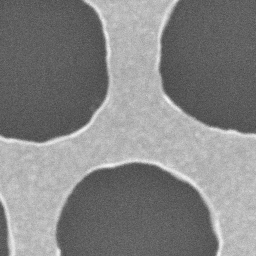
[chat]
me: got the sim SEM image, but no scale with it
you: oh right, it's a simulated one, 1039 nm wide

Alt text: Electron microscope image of holes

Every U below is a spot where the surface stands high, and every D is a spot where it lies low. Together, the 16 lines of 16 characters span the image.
DDDDDDUUUUUDDDDD
DDDDDDUUUUDDDDDD
DDDDDDDUUUDDDDDD
DDDDDDDUUUDDDDDD
DDDDDDDUUUDDDDDD
DDDDDDDUUUDDDDDD
DDDDDDUUUUUDDDDD
DDDDDDUUUUUUDDDD
DDDDUUUUUUUUUUUU
UUUUUUUUUUUUUUUU
UUUUUUDDDDUUUUUU
UUUUUDDDDDDDUUUU
UUUUDDDDDDDDDUUU
UUUUDDDDDDDDDUUU
DUUDDDDDDDDDDDUU
DUUUDDDDDDDDDDUU